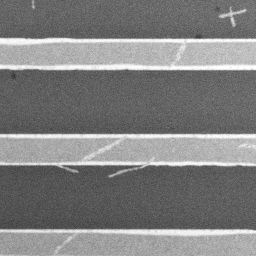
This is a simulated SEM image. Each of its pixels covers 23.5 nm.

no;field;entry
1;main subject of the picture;lines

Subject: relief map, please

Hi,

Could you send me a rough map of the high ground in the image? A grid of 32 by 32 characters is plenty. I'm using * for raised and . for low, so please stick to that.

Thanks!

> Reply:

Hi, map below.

................................
................................
................................
................................
................................
********************************
********************************
********************************
.....**..........***********..**
................................
................................
................................
................................
................................
................................
................................
................................
********************************
********************************
********************************
.*******..........*........*****
................................
................................
................................
................................
................................
................................
................................
................................
********************************
********************************
********************************